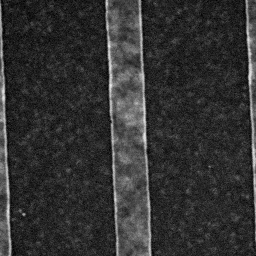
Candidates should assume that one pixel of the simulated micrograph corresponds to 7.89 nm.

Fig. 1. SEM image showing one or a few lines or trenches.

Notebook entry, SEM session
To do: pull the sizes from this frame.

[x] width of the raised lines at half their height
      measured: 264 nm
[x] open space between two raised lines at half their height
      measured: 0.839 um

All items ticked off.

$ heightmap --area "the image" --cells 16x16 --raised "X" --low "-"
-------XX------X
-------XX------X
-------XX------X
-------XX-------
-------XX-------
-------XX-------
-------XX-------
-------XX-------
-------XX-------
-------XX-------
-------XX-------
X------XX-------
X------XX-------
X------XX-------
X------XX-------
X------XX-------